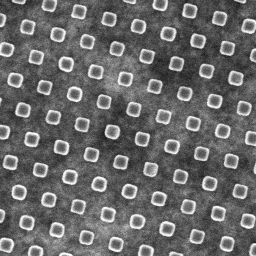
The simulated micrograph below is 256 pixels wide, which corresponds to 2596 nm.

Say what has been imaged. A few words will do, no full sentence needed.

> a regular array of raised bodies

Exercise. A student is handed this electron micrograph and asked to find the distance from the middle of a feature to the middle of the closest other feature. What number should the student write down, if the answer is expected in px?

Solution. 30.4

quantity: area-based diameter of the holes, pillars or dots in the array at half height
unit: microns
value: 0.146